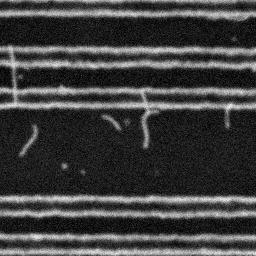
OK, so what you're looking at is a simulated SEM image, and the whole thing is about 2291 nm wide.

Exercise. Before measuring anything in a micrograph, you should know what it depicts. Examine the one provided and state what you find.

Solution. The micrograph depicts lines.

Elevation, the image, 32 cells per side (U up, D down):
UUUUUUUUUUUUUUUUUUUUUUUUUUUUUUUU
UUUUUUUUUUUUUUUUUUUUUUUUUUUUUUUU
DDDDDDDDDDDDDDDDDDDDDDDDDDDDDDDD
DDDDDDDDDDDDDDDDDDDDDDDDDDDDDDDD
DDDDDDDDDDDDDDDDDDDDDDDDDDDDDDDD
DDDDDDDDDDDDDDDDDDDDDDDDDDDDDDDD
UUUUUUUUUUUUUUUUUUUUUUUUUUUUUUUU
UUUUUUUUUUUUUUUUUUUUUUUUUUUUUUUU
DDDDDDDDDDDDDDDDDDDDDDDDDDDDDDDD
DDDDDDDDDDDDDDDDDDDDDDDDDDDDDDDD
DDDDDDDDDDDDDDDDDDDDDDDDDDDDDDDD
UUUUUUUUUUUUUUUUUUUUUUUUUUUUUUUU
UUUUUUUUUUUUUUUUUUUUUUUUUUUUUUUU
DDDDDDDDDDDDDDDDDDDDDDDDDDDDUDDD
DDDDDDDDDDDDDDDDDDDDDDDDDDDDDDDD
DDDDDDDDDDDDDDDDDDDDDDDDDDDDDDDD
DDDDDDDDDDDDDDDDDDDDDDDDDDDDDDDD
DDDDDDDDDDDDDDDDDDDDDDDDDDDDDDDD
DDDDDDDDDDDDDDDDDDDDDDDDDDDDDDDD
DDDDDDDDDDDDDDDDDDDDDDDDDDDDDDDD
DDDDDDDDDDDDDDDDDDDDDDDDDDDDDDDD
DDDDDDDDDDDDDDDDDDDDDDDDDDDDDDDD
DDDDDDDDDDDDDDDDDDDDDDDDDDDDDDDD
DDDDDDDDDDDDDDDDDDDDDDDDDDDDDDDD
DDDDDDDDDDDDDDDDDDDDDDDDDDDDDDDD
UUUUUUUUUUUUUUUUUUUUUUUUUUUUUUUU
UUUUUUUUUUUUUUUUUUUUUUUUUUUUUUUU
DDDDDDDDDDDDDDDDDDDDDDDDDDDDDDDD
DDDDDDDDDDDDDDDDDDDDDDDDDDDDDDDD
DDDDDDDDDDDDDDDDDDDDDDDDDDDDDDDD
UUUUUUUUUUUUUUUUUUUUUUUUUUUUUUUU
UUUUUUUDUUUUUUUUUUUUUUUUUUUUUUUU